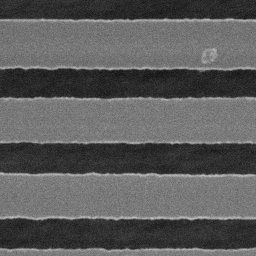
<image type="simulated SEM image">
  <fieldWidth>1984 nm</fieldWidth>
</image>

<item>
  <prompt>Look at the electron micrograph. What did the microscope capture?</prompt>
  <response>lines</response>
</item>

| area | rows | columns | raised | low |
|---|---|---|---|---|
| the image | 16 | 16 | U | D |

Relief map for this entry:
DDDDDDDDDDDDDDDD
UUUUUUUUUUUUUUUU
UUUUUUUUUUUUUUUU
UUUUUUUUUUUUUUUU
DDDDDDDDDDDDDDDD
DDDDDDDDDDDDDDDD
UUUUUUUUUUUUUUUU
UUUUUUUUUUUUUUUU
UUUUUUUUUUUUUUUU
DDDDDDDDDDDDDDDD
DDDDDDDDDDDDDDDD
UUUUUUUUUUUUUUUU
UUUUUUUUUUUUUUUU
UUUUUUUUUUUUUUUU
DDDDDDDDDDDDDDDD
DDDDDDDDDDDDDDDD